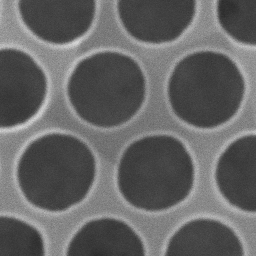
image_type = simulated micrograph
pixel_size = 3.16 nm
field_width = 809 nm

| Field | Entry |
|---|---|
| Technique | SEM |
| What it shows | holes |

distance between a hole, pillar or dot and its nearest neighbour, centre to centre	306	nm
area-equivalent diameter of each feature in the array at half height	0.248	micrometres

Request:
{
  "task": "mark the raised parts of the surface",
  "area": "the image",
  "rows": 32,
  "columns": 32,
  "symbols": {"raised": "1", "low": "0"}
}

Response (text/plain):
11000000000011100000000001100000
11000000000011100000000001100000
11100000000011100000000011100000
11100000000111110000000011110000
11110000000001110000000111110000
11111100000000111100111111111100
00011111000000011111111100011111
00001111000000000111110000000111
00000111100000000011110000000011
00000011100000000011100000000011
00000011000000000011100000000001
00000011000000000011100000000001
00000011100000000011100000000011
00000101100000000011100000000011
00000001110000000111110000000111
00010001111000001111111000001110
00000001111111111111111111111110
00010000001111111000001111111000
00000000000111110000000111110000
00000000000011100000000011100000
11000000000011100000000011100000
11000000000011100000000011100000
11000000000011100000000011100000
11000000000111100000000011100000
11100000000111100000000011110000
11110000001111110000001111111000
11111100111111111111111111111110
00011111111000011111111100011111
00001111110000001111110000000111
00000111100000000111100000000011
00000011000000000011100000000011
00000011000000000011100000000001